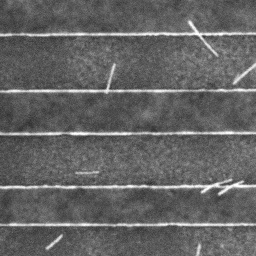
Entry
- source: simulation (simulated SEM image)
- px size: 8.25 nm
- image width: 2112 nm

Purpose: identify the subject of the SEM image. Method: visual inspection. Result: lines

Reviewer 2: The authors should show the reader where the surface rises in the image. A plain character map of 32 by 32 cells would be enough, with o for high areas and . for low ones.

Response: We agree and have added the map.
oooooooooooooooooooooooooooooooo
oooooooooooooooooooooooooooooooo
oooooooooooooooooooooooooooooooo
oooooooooooooooooooooooooooooooo
................................
................................
................................
................................
................................
................................
................................
oooooooooooooooooooooooooooooooo
oooooooooooooooooooooooooooooooo
oooooooooooooooooooooooooooooooo
oooooooooooooooooooooooooooooooo
oooooooooooooooooooooooooooooooo
oooooooooooooooooooooooooooooooo
................................
................................
................................
................................
................................
................................
oooooooooooooooooooooooooooooooo
oooooooooooooooooooooooooooooooo
oooooooooooooooooooooooooooooooo
oooooooooooooooooooooooooooooooo
oooooooooooooooooooooooooooooooo
................................
................................
................................
................................